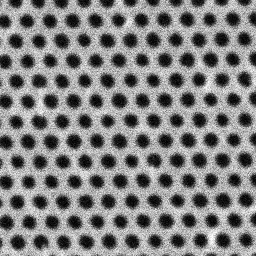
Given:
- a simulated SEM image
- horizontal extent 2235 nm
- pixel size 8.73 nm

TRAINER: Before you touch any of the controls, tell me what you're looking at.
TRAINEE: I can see a regular array of holes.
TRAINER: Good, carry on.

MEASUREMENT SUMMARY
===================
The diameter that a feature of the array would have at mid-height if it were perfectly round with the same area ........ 133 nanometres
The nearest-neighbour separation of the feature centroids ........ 0.198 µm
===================